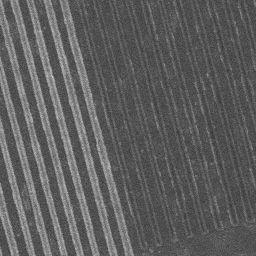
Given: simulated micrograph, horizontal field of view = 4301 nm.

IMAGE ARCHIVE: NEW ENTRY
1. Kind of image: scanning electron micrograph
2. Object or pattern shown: parallel lines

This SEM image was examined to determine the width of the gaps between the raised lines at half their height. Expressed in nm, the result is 183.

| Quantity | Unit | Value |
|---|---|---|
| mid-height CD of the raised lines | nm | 77.3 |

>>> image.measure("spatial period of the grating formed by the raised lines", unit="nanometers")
264